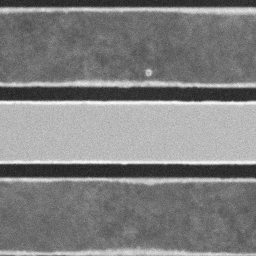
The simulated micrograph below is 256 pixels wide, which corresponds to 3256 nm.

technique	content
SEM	lines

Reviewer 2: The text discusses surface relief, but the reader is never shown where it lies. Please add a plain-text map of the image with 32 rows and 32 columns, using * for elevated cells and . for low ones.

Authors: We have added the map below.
................................
********************************
********************************
********************************
********************************
********************************
********************************
********************************
********************************
********************************
********************************
................................
................................
********************************
********************************
********************************
********************************
********************************
********************************
********************************
................................
................................
*****************...************
********************************
********************************
********************************
********************************
********************************
********************************
********************************
********************************
********************************